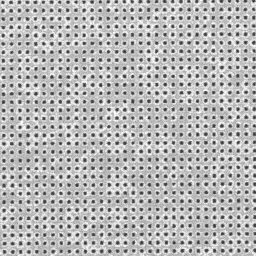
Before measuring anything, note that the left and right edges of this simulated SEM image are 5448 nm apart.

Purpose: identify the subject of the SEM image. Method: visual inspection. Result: a regular array of holes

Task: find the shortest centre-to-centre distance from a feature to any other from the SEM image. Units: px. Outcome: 7.89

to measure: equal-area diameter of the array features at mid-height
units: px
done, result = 3.91